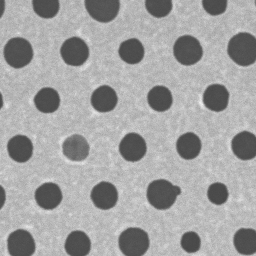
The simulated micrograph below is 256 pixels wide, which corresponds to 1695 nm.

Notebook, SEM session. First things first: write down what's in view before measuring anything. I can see a regular array of holes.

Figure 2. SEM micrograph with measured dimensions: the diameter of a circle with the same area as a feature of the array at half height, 182 nanometres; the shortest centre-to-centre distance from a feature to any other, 364 nanometers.